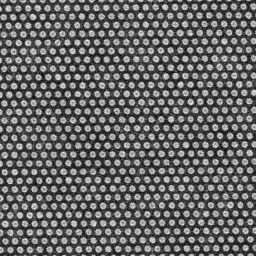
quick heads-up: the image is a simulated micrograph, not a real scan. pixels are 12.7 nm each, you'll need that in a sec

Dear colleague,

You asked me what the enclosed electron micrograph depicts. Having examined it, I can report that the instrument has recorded a regular array of raised bodies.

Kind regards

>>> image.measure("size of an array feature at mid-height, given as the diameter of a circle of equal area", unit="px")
5.75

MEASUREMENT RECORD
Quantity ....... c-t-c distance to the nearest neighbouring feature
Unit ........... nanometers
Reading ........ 120